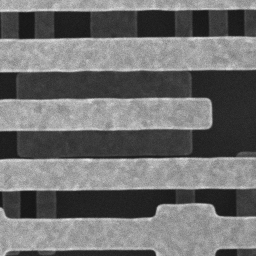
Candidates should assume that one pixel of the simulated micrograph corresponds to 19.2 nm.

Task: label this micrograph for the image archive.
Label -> wiring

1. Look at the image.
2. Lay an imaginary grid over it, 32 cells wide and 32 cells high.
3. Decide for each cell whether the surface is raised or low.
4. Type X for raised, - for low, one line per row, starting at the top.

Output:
XXXXXXXXXXXXXXXXXXXXXXXXXXXXXXXX
--------------------------------
--------------------------------
--------------------------------
--------------------------------
XXXXXXXXXXXXXXXXXXXXXXXXXXXXXXXX
XXXXXXXXXXXXXXXXXXXXXXXXXXXXXXXX
XXXXXXXXXXXXXXXXXXXXXXXXXXXXXXXX
XXXXXXXXXXXXXXXXXXXXXXXXXXXXXXXX
--------------------------------
--------------------------------
--------------------------------
XXX---XXXXXXXXXXXXXXXXXXXX------
XXXXXXXXXXXXXXXXXXXXXXXXXX------
XXXXXXXXXXXXXXXXXXXXXXXXXX------
XXXXXXXXXXXXXXXXXXXXXXXXXX------
--------------------------------
--------------------------------
--------------------------------
--------------------------------
XXXXXXXXXXXXXXXXXXXXXXXXXXXXXXXX
XXXXXXXXXXXXXXXXXXXXXXXXXXXXXXXX
XXXXXXXXXXXXXXXXXXXXXXXXXXXXXXXX
XXXXXXXXXXXXXXXXXXXXXXXXXXXXXXXX
--------------------------------
-----------------------XX-------
X-------------------XXXXXXX-----
XXXXXXXXXXXXXXXXXXXXXXXXXXXXXXXX
XXXXXXXXXXXXXXXXXXXXXXXXXXXXXXXX
XXXXXXXXXXXXXXXXXXXXXXXXXXXXXXXX
XXXXXXXXXXXXXXXXXXXXXXXXXXXXXXXX
X------------------XXXXXXXX-----